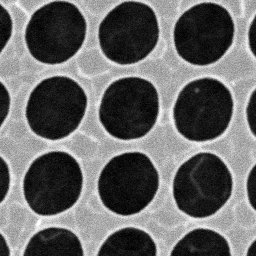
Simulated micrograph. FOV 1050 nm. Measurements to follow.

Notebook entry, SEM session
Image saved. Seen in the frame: a regular array of holes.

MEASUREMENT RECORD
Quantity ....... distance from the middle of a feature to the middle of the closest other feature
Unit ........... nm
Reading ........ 303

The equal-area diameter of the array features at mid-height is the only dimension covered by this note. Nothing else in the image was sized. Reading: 0.255 µm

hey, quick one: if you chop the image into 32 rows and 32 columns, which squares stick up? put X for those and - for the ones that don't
XXXXXX---XXXXXX---XXXXXXX--XXXXX
-XXX------XXXX-----XXXX------XXX
--XX-------XX-------XX-------XXX
--X--------X--------XX-------XX-
-XX--------X--------XX-------XX-
-XX-------XX--------XX-------XX-
XXXX------XXX------XXX------XXX-
XXXX----XXXXXX----XXXXX----XXXXX
XXXXXXXXXXXXXXXXXXXXXXXXXXXXXXXX
XXXXXXX-XXXXXXXXXXXXXXXXXXXXXXXX
XXXXX-----XXXX-----XXXX-----XXXX
-XXX-------XX-------XXX------XXX
-XXX-------XX-------XX-------XX-
-XX--------X--------XX-------XX-
-XX-------XX--------XX-------XX-
XXXX------XXX------XXX-------XX-
XXXX-----XXXX------XXX------XXX-
XXXXXX-XXXXXXXX-XXXXXXXX--XXXXXX
XXXXXXXXXXXXXXXXXXXXXXXXXXXXXXXX
XXXXX----XXXXXX---XXXXXX---XXXXX
-XXX------XXX------XXXX-----XXXX
-XX-------XXX-------XX-------XX-
-XX-------XX--------XX-------XX-
-XX-------XX--------XX-------XX-
-XX-------XX-------XXX-------XX-
XXX------XXXX------XXX------XXX-
XXXX----XXXXXX----XXXXX----XXXXX
XXXXXXXXXXXXXXXXXXXXXXXXXXXXXXXX
XXXXXX--XXXXXXXX-XXXXXXXXXXXXXXX
XXXX------XXXX-----XXXX-----XXXX
-XX-------XXX------XXX------XXX-
-XX-------XX--------X--------XX-